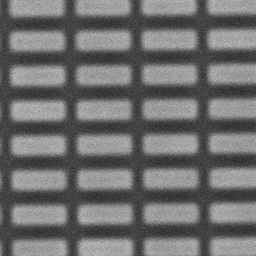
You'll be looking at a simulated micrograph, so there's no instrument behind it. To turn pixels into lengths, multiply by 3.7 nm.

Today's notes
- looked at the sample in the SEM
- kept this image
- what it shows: groups of lines, slits or small figures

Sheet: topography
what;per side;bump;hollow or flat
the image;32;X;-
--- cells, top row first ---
-XXXXXXX--XXXXXX--XXXXXX--XXXXXX
-XXXXXXX--XXXXXX--XXXXXX--XXXXXX
--------------------------------
--------------------------------
-XXXXXXX--XXXXXX--XXXXXX--XXXXXX
-XXXXXXX--XXXXXX--XXXXXX--XXXXXX
--------------------------------
--------------------------------
--XXXXXX--XXXXXX--XXXXXX--XXXXXX
-XXXXXXX--XXXXXX--XXXXXXX-XXXXXX
--XXXXXX--XXXXXX----------------
--------------------------------
------------------------------XX
-XXXXXXX--XXXXXX--XXXXXXX-XXXXXX
-XXXXXXX--XXXXXX--XXXXXX--XXXXXX
--------------------------------
--------------------------------
--XXXXXX--XXXXXX--XXXXXXX-XXXXXX
-XXXXXXX--XXXXXX--XXXXXXX-XXXXXX
--------------------------------
--------------------------------
--XXXXXX--XXXXXX--XXXXXXX-XXXXXX
--XXXXXX--XXXXXX--XXXXXXX-XXXXXX
--XXXXXX--XXXXXX----------------
--------------------------------
-------------------------------X
--XXXXXX--XXXXXX--XXXXXXX-XXXXXX
--XXXXXX--XXXXXX--XXXXXXX--XXXXX
--------------------------------
--------------------------------
--XXXXXX--XXXXXX--XXXXXXX-XXXXXX
--XXXXXX--XXXXXX--XXXXXXX-XXXXXX